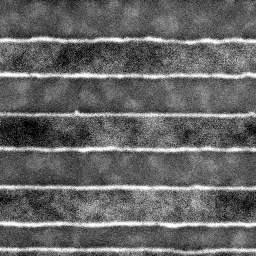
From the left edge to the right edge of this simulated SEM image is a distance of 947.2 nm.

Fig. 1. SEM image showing one or a few lines or trenches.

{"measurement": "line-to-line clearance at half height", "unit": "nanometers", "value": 137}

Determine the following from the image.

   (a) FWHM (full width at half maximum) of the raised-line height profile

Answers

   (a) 137 nanometers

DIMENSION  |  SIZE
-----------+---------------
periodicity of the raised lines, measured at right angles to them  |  274 nm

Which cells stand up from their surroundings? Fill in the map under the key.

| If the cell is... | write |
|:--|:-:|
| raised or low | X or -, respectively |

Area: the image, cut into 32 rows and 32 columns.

--------------------------------
--------------------------------
--------------------------------
--------------------------------
--------------------------------
XXXXXXXXXXXXXXXXXXXXXXXXXXXXXXXX
XXXXXXXXXXXXXXXXXXXXXXXXXXXXXXXX
XXXXXXXXXXXXXXXXXXXXXXXXXXXXXXXX
XXXXXXXXXXXXXXXXXXXXXXXXXXXXXXXX
------XXXXXXXXXXXXXXXX-X----XX--
--------------------------------
--------------------------------
--------------------------------
--------------------------------
XXXXXXXXXXXXXXXXXXXXXXXXXXXXXXXX
XXXXXXXXXXXXXXXXXXXXXXXXXXXXXXXX
XXXXXXXXXXXXXXXXXXXXXXXXXXXXXXXX
XXXXXXXXXXXXXXXXXXXXXXXXXXXXXXXX
XXXXXXXXXXXXXXXXXXXXXXXXXXXXXXXX
--------------------------------
--------------------------------
--------------------------------
--------------------------------
XXXXXXXXXXXXXXXXXXXXXXXXXX------
XXXXXXXXXXXXXXXXXXXXXXXXXXXXXXXX
XXXXXXXXXXXXXXXXXXXXXXXXXXXXXXXX
XXXXXXXXXXXXXXXXXXXXXXXXXXXXXXXX
XXXXXXXXXXXXXXXXXXXXXXXXXXXXXXXX
--------------------------------
--------------------------------
--------------------------------
XXXXXXXXXXXXXXXXXXXXXXXX-XXXXXXX